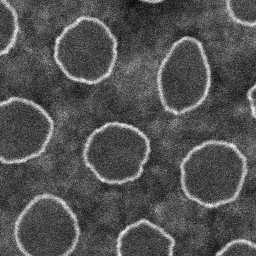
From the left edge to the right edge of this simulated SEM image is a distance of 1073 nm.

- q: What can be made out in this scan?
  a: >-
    raised bodies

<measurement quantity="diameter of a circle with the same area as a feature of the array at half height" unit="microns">0.259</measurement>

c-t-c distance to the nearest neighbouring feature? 419 nanometers